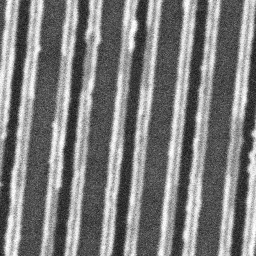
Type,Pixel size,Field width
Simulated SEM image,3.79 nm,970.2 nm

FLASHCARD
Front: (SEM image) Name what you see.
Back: parallel lines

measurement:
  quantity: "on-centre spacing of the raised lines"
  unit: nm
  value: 114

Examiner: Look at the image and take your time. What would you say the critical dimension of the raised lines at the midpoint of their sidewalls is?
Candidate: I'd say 0.0405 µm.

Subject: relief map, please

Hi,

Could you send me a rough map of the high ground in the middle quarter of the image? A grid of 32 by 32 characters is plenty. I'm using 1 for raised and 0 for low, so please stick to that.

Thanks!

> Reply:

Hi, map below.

11000111000000110000110000000110
11000110000000110000110000000110
11000110000000110000110000000110
11000110000000110000110000000110
10000110000000110000110000001110
10000110000000110001110000001110
10000110000000110001110000001110
10001100000001110001110000001100
10001100000001110001110000001100
10001110000001100001110000001100
10001100000001100001100000001100
10001100000001100001100000001100
10001100000001100001100000001100
10001100000001100011100000001100
00001100000001100011100000011100
00011100000001100011100000011100
00011100000001100011000000011000
00011100000011100011100000011000
00011100000011100011000000011000
00011100000011100011000000011000
00011100000011100011000000011000
00011000000011000011000000111000
00011000000011000011000000111000
00011000000011000011000000111000
00011000000011000011000000111000
00011000000011000111000000111000
00011000000111000111000000110000
00011000000111000111000000110000
00111000000111000110000000110000
00111000000111000110000000110000
00110000000110000110000000110001
00110000000110000110000001110001